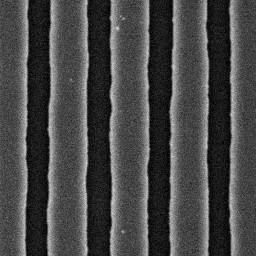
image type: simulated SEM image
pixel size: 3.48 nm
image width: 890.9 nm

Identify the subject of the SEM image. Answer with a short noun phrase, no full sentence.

lines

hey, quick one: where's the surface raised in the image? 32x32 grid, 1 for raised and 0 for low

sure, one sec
11100011111000111110001111000111
11100011111000111110001111000111
11100011111000111110001111000111
11100011111000111110001111000111
11100011111000111110001111000111
11100011111000111110001111000111
11100011111000111110001111000111
11100011111000111110001111000111
11100011111000111100011111000111
11100011111000111100001111000111
11100011111000111110001111000111
11100011111000111100001111000111
11100011111000111100011111000111
11100011111000111110011111000111
11100011111000111110011111000111
11100011111000111110011111000111
11100011111000111110011111000111
11100011111000111110011111000111
11100011111000111110011111000111
11100011111000111110011111000111
11100011111000111100011111000111
11100011111000111100011111000111
11100011111000111100011111000111
11100011111000111100011111000111
11100011111000111100011111000111
11100011111000111100011111000111
11100011111000111100011111000111
11100011111000111100011111000111
11100011111000111100011111000111
11100011111000111100011111000111
11100011111000111100011111000111
11100011111000111100011111000111